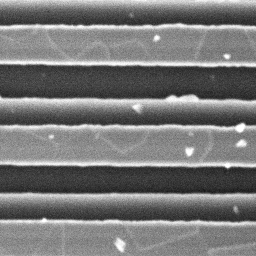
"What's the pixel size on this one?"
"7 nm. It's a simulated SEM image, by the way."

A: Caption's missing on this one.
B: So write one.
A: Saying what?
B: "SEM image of lines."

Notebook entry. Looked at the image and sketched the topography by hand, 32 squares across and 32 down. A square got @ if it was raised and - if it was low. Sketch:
--------------------------------
--------------------------------
--------------------------------
@@@@@@@@@@@@@@@@@@@@@@@@@@@@@@@@
@@@@@@@@@@@@@@@@@@@@@@@@@@@@@@@@
@@@@@@@@@@@@@@@@@@@@@@@@@@@@@@@@
@@@@@@@@@@@@@@@@@@@@@@@@@@@@@@@@
@@@@@@@@@@@@@@@@@@@@@@@@@@@@@@@@
--------------------------------
--------------------------------
--------------------------------
--------------------------------
--------------------------------
--------------------------------
--------------------------------
--------------------------------
@@@@@@@@@@@@@@@@@@@@@@@@@@@@@@@@
@@@@@@@@@@@@@@@@@@@@@@@@@@@@@@@@
@@@@@@@@@@@@@@@@@@@@@@@@@@@@@@@@
@@@@@@@@@@@@@@@@@@@@@@@@@@@@@@@@
-@@@@@@@@@@@@@@@@@@@@@@@@@@@@@@@
--------------------------------
--------------------------------
--------------------------------
--------------------------------
--------------------------------
--------------------------------
-----@--------------------------
@@@@@@@@@@@@@@@@@@@@@@@@@@@@@@@@
@@@@@@@@@@@@@@@@@@@@@@@@@@@@@@@@
@@@@@@@@@@@@@@@@@@@@@@@@@@@@@@@@
@@@@@@@@@@@@@@@@@@@@@@@@@@@@@@@@